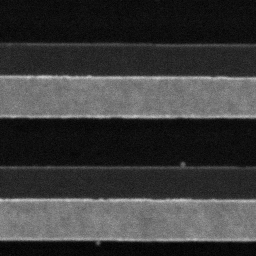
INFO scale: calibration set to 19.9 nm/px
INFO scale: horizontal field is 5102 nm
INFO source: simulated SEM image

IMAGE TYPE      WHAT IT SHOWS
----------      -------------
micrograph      lines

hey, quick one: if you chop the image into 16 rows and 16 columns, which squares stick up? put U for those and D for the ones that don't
DDDDDDDDDDDDDDDD
DDDDDDDDDDDDDDDD
DDDDDDDDDDDDDDDD
UUUUUUUUUUUUUUUU
UUUUUUUUUUUUUUUU
UUUUUUUUUUUUUUUU
UUUUUUUUUUUUUUUU
DDDDDDDDDDDDDDDD
DDDDDDDDDDDDDDDD
DDDDDDDDDDDDDDDD
UUUUUUDDDUDDDDDD
UUUUUUUUUUUUUUUU
UUUUUUUUUUUUUUUU
UUUUUUUUUUUUUUUU
UUUUUUUUUUUUUUUU
DDDDDDDDDDDDDDDD